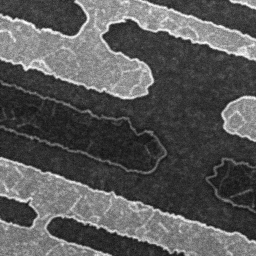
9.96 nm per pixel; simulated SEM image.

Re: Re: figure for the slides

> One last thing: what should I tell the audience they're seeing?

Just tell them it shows one or a few lines or trenches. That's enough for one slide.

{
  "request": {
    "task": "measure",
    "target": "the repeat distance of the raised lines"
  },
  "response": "668 nm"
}